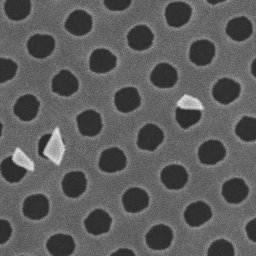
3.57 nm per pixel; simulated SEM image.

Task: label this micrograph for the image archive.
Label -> a regular array of holes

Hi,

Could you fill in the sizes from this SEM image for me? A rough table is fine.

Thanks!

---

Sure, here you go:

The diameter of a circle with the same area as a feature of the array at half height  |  0.0945 microns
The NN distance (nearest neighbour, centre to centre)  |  0.157 µm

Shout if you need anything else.